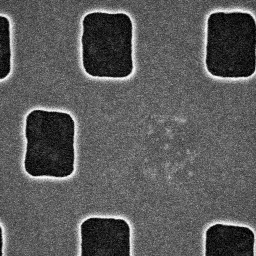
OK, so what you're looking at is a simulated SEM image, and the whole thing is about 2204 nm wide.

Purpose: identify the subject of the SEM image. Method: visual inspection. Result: holes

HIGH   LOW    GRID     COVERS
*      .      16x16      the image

****************
.****...*****...
.****...*****...
.****...*****...
******..*****...
****************
****************
**..************
**...***********
**...***********
**...***********
****************
****************
****************
*****...*****...
*****...*****...